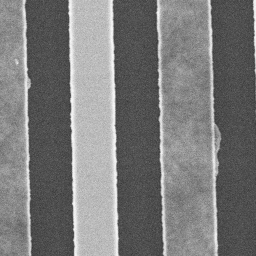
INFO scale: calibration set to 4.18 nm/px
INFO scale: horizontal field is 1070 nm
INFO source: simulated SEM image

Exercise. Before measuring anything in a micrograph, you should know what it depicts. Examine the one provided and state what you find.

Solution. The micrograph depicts lines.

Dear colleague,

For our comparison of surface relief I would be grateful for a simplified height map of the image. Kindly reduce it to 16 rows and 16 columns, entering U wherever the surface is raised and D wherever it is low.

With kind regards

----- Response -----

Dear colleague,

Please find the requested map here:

UUDDUUUDDDUUUDDD
UUDDUUUDDDUUUDDD
UUDDUUUDDDUUUDDD
UUDDUUUDDDUUUDDD
UUDDUUUDDDUUUDDD
UUDDUUUDDDUUUDDD
UUDDUUUDDDUUUDDD
UUDDUUUDDDUUUDDD
UUDDUUUDDDUUUDDD
UUDDUUUDDDUUUDDD
UUDDDUUDDDUUUDDD
UUDDDUUDDDUUUDDD
UUDDDUUDDDUUUDDD
UUDDDUUDDDUUUUDD
UUDDDUUDDDUUUUDD
UUDDDUUDDDUUUUDD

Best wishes